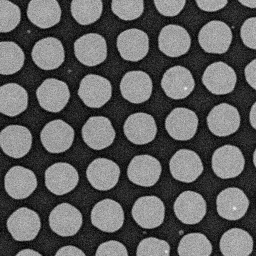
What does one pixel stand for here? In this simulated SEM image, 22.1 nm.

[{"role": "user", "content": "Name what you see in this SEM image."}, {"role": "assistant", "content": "an array of small figures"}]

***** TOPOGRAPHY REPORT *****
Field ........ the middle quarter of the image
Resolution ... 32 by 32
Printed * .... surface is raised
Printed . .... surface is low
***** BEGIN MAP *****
................................
..........................*****.
...............******....*******
.....*****.....******....*******
....*******...********..********
*...********..********..********
*...********..********...*******
*...********...*******....*****.
*...********...******......***..
*....******......**.............
......***.......................
...........................****.
.................****.....******
.......****.....******....******
......******...********..*******
*....*******...********..*******
**...*******...********...******
**...********..********...******
**...********...******.....*****
**...*******.....****...........
**....*****.....................
.............................**.
............................****
.................*****.....*****
.......*****.....*******...*****
**....*******...********..******
***...********..********...*****
***...********..********...*****
****..********..********....****
***...*******....******.......*.
***....******.......*...........
**..............................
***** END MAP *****